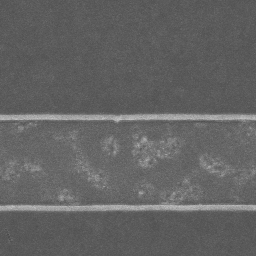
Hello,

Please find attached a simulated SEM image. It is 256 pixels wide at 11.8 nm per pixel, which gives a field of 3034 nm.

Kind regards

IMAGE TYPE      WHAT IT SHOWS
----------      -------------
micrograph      one or a few lines or trenches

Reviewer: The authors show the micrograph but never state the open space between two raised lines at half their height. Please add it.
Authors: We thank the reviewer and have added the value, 1.06 um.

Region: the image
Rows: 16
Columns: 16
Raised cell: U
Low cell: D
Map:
UUUUUUUUUUUUUUUU
UUUUUUUUUUUUUUUU
UUUUUUUUUUUUUUUU
UUUUUUUUUUUUUUUU
UUUUUUUUUUUUUUUU
UUUUUUUUUUUUUUUU
UUUUUUUUUUUUUUUU
DDDDDDDDDDDDDDDD
DDDDDDDDDDDDDDDD
DDDDDDDDDDDDDDDD
DDDDDDDDDDDDDDDD
DDDDDDDDDDDDDDDD
DDDDDDDDDDDDDDDD
UUUUUUUUUUUUUUUU
UUUUUUUUUUUUUUUU
UUUUUUUUUUUUUUUU